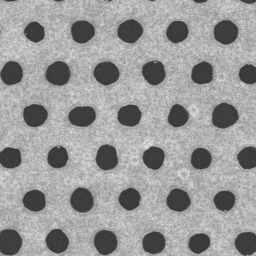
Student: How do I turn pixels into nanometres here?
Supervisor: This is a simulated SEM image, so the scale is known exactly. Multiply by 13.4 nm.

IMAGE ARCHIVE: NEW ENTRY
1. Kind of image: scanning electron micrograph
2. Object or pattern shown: a regular array of holes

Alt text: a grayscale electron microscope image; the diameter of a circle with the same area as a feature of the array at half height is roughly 0.31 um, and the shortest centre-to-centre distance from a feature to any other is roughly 629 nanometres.